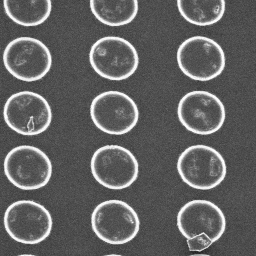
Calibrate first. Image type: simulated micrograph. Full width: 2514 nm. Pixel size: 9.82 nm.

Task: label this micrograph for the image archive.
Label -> a regular array of raised bodies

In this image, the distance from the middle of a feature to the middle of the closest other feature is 532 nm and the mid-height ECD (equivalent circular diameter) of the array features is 422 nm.